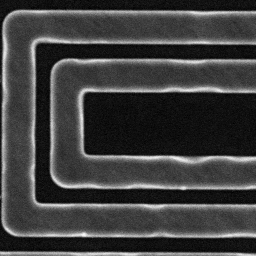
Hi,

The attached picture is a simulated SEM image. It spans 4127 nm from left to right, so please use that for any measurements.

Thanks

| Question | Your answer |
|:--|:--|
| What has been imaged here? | groups of lines, slits or small figures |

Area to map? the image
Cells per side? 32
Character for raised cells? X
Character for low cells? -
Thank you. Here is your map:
--------------------------------
--XXXXXXXXXXXXXXXXXXXXXX-----XXX
-XXXXXXXXXXXXXXXXXXXXXXXXXXXXXXX
XXXXXXXXXXXXXXXXXXXXXXXXXXXXXXXX
XXXXXXXXXXXXXXXXXXXXXXXXXXXXXXXX
-XXX----------------------------
-XXX----------------------------
XXXX----XX---XXXXXXXXX----X-----
XXXX---XXXXXXXXXXXXXXXXXXXXXXXXX
XXXX--XXXXXXXXXXXXXXXXXXXXXXXXXX
XXXX--XXXXXXXXXXXXXXXXXXXXXXXXXX
-XXX--XXXXX---------------------
XXXX--XXXX----------------------
XXXX--XXXX----------------------
XXXX--XXXX----------------------
XXXX--XXXX----------------------
XXXX--XXXX----------------------
XXXX--XXXX----------------------
XXXX--XXXX----------------------
XXXX--XXXXXXXX------------------
XXXX--XXXXXXXXXXXXXXXXXXXXXXXXXX
XXXX--XXXXXXXXXXXXXXXXXXXXXXXXXX
XXXX---XXXXXXXXXXXXXXXXXXXXXXXXX
XXXX--------XXXX----XXXXXXXXXXXX
XXXX----------------------------
XXXXX---------------------------
XXXXXXXXXXXXXXXXXXXXXXXXXXXXXXXX
XXXXXXXXXXXXXXXXXXXXXXXXXXXXXXXX
-XXXXXXXXXXXXXXXXXXXXXXXXXXXXXXX
--XXXX-XX-XXXXXXXXX--XXXXXXXX--X
--------------------------------
--------------------------------